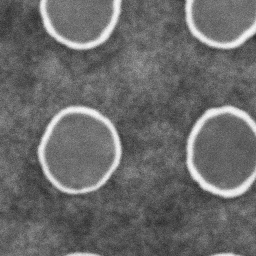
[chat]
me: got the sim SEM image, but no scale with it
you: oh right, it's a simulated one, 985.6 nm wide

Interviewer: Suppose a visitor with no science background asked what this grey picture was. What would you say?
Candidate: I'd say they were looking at raised bodies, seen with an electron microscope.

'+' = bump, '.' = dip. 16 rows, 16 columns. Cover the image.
...++++.....++++
...++++.....++++
....++.......++.
................
................
................
................
...++++......+++
...++++.....++++
...++++.....++++
...++++.....++++
...+++.......+++
................
................
................
................